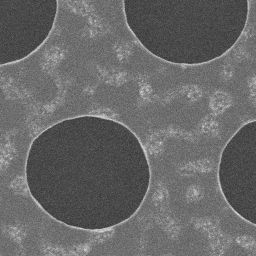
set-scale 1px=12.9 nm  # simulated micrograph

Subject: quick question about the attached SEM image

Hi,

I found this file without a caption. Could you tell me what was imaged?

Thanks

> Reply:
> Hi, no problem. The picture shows holes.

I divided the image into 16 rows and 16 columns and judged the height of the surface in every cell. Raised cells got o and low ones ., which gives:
....oooo.......o
...ooooo.......o
...oooooo......o
..oooooooo....oo
oooooooooooooooo
oooooooooooooooo
oooooooooooooooo
oooo...ooooooooo
oo......ooooooo.
oo.......ooooo..
oo.......ooooo..
oo.......ooooo..
oo.......ooooo..
ooo.....ooooooo.
oooooooooooooooo
oooooooooooooooo